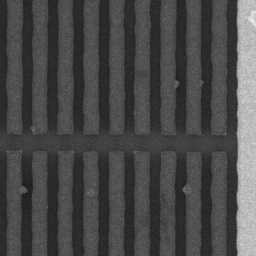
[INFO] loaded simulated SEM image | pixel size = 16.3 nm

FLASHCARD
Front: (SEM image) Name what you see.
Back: groups of lines, slits or small figures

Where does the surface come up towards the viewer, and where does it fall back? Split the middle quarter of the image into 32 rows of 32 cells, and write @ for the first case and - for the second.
@@---@@@@---@@@---@@@---@@@@---@
@@---@@@----@@@---@@@---@@@@---@
@@---@@@----@@@---@@@---@@@@---@
@@---@@@----@@@---@@@---@@@@---@
@@---@@@----@@@---@@@---@@@@---@
@@---@@@----@@@---@@@---@@@@---@
@@---@@@----@@@---@@@---@@@@---@
@@---@@@----@@@---@@@---@@@@---@
@@---@@@---@@@@---@@@---@@@@---@
@@---@@@---@@@@---@@@---@@@@---@
@@---@@@----@@@---@@@---@@@@---@
@@---@@@----@@@---@@@---@@@@---@
@@---@@@@---@@@---@@@---@@@@---@
@@---@@@@---@@@---@@@---@@@@---@
@@---@@@@---@@@---@@@---@@@@---@
@@---@@@@---@@@---@@@---@@@@---@
@@---@@@@---@@@---@@@---@@@@---@
-------------------------@@@----
--------------------------------
--------------------------------
--------------------------------
--------------------------------
@@---@@@---@@@@---@@@---@@@@---@
@@---@@@---@@@@---@@@---@@@@---@
@@---@@@---@@@@---@@@---@@@@---@
@@---@@@----@@@---@@@---@@@@---@
@@---@@@----@@@---@@@---@@@@---@
@@---@@@----@@@---@@@---@@@@---@
@@---@@@---@@@@---@@@---@@@@---@
@@---@@@---@@@@---@@@---@@@@---@
@@---@@@---@@@@---@@@---@@@@--@@
@@---@@@---@@@@---@@@---@@@@--@@